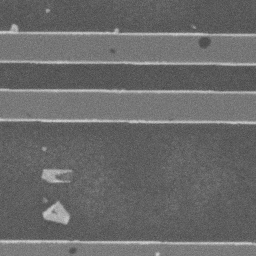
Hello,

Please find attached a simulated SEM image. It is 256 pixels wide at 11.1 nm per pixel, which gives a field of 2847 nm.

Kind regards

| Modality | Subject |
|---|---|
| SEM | lines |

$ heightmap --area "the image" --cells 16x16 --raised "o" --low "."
................
................
oooooooooooooooo
oooooooooooooooo
................
................
oooooooooooooooo
oooooooooooooooo
................
................
................
................
................
...o............
................
oooooooooooooooo